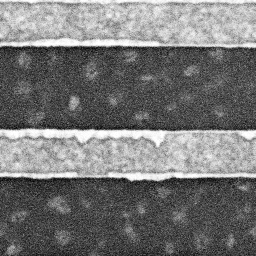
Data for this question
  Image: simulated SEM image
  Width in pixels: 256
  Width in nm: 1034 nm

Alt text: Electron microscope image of one or a few lines or trenches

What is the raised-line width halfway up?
188 nanometres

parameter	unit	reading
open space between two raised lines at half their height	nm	344